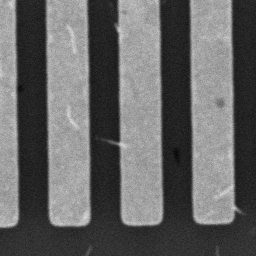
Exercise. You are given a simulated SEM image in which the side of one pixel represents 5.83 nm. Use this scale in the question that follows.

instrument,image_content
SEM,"wiring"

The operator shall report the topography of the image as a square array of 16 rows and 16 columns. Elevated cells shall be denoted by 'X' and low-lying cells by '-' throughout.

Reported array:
X--XX--XXX--XX--
X--XX--XXX--XX--
X--XX--XXX--XX--
X--XX--XXX--XXX-
X--XX--XXX--XXX-
X--XXX--XX--XXX-
X--XXX--XX--XXX-
X--XXX--XX--XXX-
X--XXX-XXX--XXX-
X--XXX--XX--XXX-
X--XXX--XX--XXX-
X--XXX--XX--XXX-
X--XXX--XX--XXX-
X--XXX--XX--XXX-
----------------
----------------